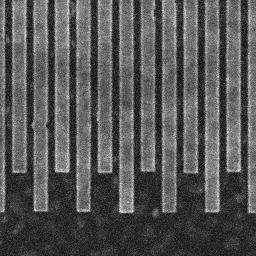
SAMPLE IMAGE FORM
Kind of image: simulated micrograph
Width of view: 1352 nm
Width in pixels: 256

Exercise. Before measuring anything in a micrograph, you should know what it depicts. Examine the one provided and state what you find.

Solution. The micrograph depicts parallel lines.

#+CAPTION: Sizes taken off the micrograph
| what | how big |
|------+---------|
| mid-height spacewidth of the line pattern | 44.9 nanometers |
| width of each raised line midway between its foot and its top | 69.3 nm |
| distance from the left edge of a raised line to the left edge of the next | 0.113 micrometres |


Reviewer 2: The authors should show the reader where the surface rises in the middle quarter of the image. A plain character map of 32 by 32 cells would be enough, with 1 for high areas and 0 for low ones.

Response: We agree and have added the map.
10011100011100111001110001110011
10011100011100111001110001110011
10011100011100111001110001110011
10011100011100111001110001110011
10011100011100111001110001110011
10011100011100111001110001110011
10011100011100111001110001110011
10011100011100111001110001110011
10011100011100111001110001110011
10011100011100111001110001110011
10011100011100111001110001110011
10011100011100111001110001110011
10011100111100111001110001110011
10011100111100111001110001110011
10011100011100111001110001110011
10011100011100111001110001110011
10011100011100111001110001110011
10011100011100111001110001110011
10011100011100111001110001110011
10011100011100111001110001110011
10011100011100111001110001110011
10011100011100111001110001110011
10011100011100111001110001110011
10011100011100111001110001110011
10011100011100111001110001110011
10011100011100111001110001110011
10011100011100111001110001110011
00011100000000111000000001110000
00011100000000111000000001110000
00011100000000111000000001110000
00011100000000111000000001110000
00011100000000111000000001110000